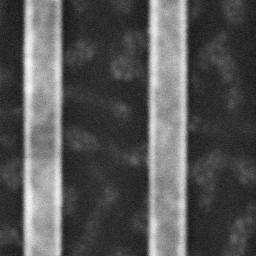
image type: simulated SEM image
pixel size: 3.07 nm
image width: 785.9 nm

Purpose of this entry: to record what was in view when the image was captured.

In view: one or a few lines or trenches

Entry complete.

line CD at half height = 96.7 nanometres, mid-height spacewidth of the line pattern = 288 nm